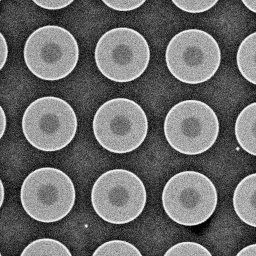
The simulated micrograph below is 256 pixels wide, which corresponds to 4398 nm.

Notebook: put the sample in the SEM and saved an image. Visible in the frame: an array of small figures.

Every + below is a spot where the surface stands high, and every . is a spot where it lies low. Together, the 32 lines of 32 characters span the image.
.....++++....+++++....+++++....+
................................
................................
.....+++........................
....+++++....+++++....++++.....+
+..+++++++..++++++...++++++...++
+..+++++++..+++++++..++++++...++
+..+++++++..+++++++..++++++...++
....+++++...++++++...++++++...++
.....+++.....++++.....++++....++
................................
................................
.....+++......++................
...++++++....+++++....++++.....+
+..++++++...++++++...++++++...++
+..+++++++..++++++...++++++...++
...++++++...++++++...++++++..+++
....+++++...++++++...++++++...++
.....+++.....++++.....++++....++
................................
................................
....++++.....+++................
...++++++...+++++....+++++....++
...++++++...++++++...++++++...++
...++++++...++++++..+++++++..+++
...++++++...++++++..+++++++..+++
...++++++...++++++...++++++...++
.....++......+++......++++....++
................................
................................
....++++.....+++......+++.......
...++++++...+++++....+++++....++